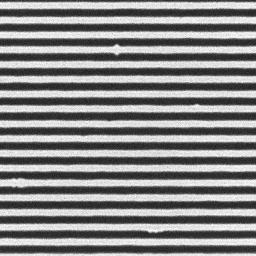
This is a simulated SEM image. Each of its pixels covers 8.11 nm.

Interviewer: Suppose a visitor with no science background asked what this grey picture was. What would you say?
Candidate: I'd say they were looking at parallel lines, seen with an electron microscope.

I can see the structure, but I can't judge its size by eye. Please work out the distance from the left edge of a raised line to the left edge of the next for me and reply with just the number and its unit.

14.8 pixels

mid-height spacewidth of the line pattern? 8 pixels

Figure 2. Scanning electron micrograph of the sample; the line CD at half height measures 0.0568 microns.